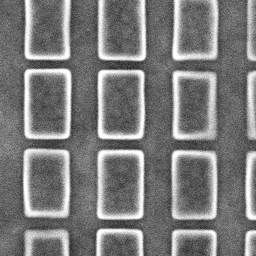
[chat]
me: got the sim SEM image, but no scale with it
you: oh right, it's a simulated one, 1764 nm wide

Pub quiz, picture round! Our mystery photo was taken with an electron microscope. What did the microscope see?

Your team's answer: wiring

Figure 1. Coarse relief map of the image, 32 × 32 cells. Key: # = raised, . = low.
...#####.....#####....#####....#
...#####.....#####....#####....#
...#####.....#####....#####....#
...#####....######....#####....#
...#####.....#####....#####....#
...#####.....#####....#####....#
...#####.....#####....#####....#
................................
................................
...######...######....####.....#
...######...######....#####....#
...######...######....#####....#
...######...######....#####....#
...######...######....#####....#
...######...######....#####....#
...######...######....####.....#
...######...######....####.....#
................................
................................
...#####....######....#####....#
...#####....######....#####....#
...#####....######....#####....#
...#####.....#####....#####....#
...#####.....#####....#####....#
...#####....######....#####....#
...#####....######....#####....#
....####....######....#####....#
................................
................................
....####....######....#####....#
...#####....######....#####....#
...#####....######....#####....#